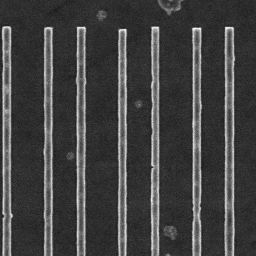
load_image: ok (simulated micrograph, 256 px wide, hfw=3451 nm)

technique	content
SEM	parallel lines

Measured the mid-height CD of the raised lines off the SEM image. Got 106 nanometers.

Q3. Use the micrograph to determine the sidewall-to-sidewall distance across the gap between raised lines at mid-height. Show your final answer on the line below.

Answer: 357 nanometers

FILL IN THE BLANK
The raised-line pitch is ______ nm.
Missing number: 500